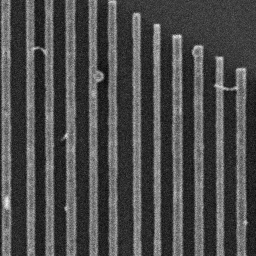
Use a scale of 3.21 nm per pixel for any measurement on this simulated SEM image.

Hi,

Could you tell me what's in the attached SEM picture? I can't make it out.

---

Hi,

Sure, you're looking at parallel lines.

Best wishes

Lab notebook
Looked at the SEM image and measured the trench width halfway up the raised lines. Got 44.2 nanometres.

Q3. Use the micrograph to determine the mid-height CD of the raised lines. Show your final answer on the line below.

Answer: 0.0225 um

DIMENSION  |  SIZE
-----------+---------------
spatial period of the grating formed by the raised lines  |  68.7 nm